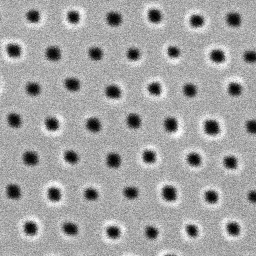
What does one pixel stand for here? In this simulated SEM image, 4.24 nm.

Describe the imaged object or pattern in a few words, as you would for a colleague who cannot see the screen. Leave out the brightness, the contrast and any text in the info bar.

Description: a regular array of holes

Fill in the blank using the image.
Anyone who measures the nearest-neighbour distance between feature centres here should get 0.158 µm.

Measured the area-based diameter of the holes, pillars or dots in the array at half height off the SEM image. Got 0.0614 micrometres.